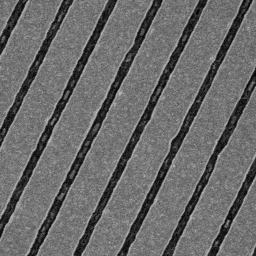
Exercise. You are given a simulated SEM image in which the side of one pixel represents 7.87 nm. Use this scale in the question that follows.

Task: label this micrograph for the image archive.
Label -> parallel lines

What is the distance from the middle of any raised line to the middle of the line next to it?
317 nanometers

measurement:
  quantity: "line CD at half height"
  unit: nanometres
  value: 249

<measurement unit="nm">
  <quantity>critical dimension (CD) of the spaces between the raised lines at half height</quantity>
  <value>67.9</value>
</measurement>